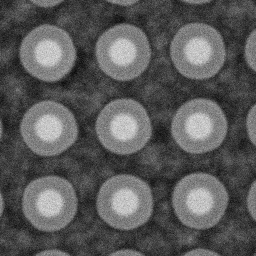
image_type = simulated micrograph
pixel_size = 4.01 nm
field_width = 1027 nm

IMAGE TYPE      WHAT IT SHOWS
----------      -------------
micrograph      an array of small figures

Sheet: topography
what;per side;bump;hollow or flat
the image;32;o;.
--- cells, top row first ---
....ooo........oo...............
................................
................................
.....oo.......ooo......oooo.....
...oooooo....ooooo....oooooo...o
...oooooo...ooooooo..ooooooo...o
...oooooo...ooooooo..ooooooo...o
...oooooo...ooooooo...oooooo...o
...oooooo....ooooo....oooooo...o
....oooo......ooo......oooo.....
................................
................................
...............oo.......oo......
....oooo.....ooooo.....oooo.....
...oooooo...oooooo....oooooo...o
...oooooo...ooooooo..ooooooo...o
...ooooooo..ooooooo..ooooooo...o
...oooooo...ooooooo...oooooo...o
....oooo.....ooooo.....oooo.....
................................
................................
................................
.....ooo.....ooooo.....oooo.....
...oooooo....oooooo...oooooo...o
...oooooo...ooooooo...oooooo...o
...ooooooo..ooooooo...oooooo...o
...oooooo...ooooooo...oooooo...o
....ooooo....ooooo.....oooo.....
.....ooo.......oo.......oo......
................................
................................
.....ooo......ooo.......ooo.....